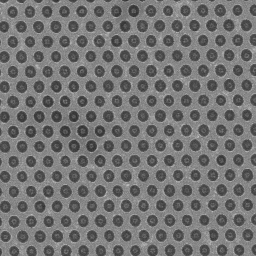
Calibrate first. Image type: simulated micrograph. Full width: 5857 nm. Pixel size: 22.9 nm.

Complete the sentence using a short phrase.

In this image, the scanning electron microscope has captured a regular array of ring-shaped grooves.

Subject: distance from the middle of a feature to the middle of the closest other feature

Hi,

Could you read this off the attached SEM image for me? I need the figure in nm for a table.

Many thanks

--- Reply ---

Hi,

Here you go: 386